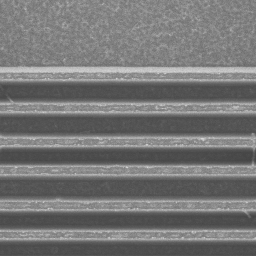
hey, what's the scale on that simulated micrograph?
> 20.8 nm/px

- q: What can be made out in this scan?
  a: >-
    parallel lines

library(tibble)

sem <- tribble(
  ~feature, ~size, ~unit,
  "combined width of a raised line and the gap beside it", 0.661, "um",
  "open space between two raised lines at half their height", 374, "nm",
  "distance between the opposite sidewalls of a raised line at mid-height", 291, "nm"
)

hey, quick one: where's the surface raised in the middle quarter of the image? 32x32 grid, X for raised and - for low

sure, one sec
--------------------------------
XXXXXXXXXXXXXXXXXXXXXXXXXXXXXXXX
XXXXXXXXXXXXXXXXXXXXXXXXXXXXXXXX
XXXXXXXXXXXXXXXXXXXXXXXXXXXXXXXX
XXXXXXXXXXXXXXXXXXXXXXXXXXXXXXXX
--------------------------------
--------------------------------
--------------------------------
--------------------------------
XXXXXXXXXXXXXXXXXXXXXXXXXXXXXXXX
XXXXXXXXXXXXXXXXXXXXXXXXXXXXXXXX
XXXXXXXXXXXXXXXXXXXXXXXXXXXXXXXX
XXXXXXXXXXXXXXXXXXXXXXXXXXXXXXXX
--------------------------------
--------------------------------
--------------------------------
--------------------------------
--------------------------------
XXXXXXXXXXXXXXXXXXXXXXXXXXXXXXXX
XXXXXXXXXXXXXXXXXXXXXXXXXXXXXXXX
XXXXXXXXXXXXXXXXXXXXXXXXXXXXXXXX
--------------------------------
--------------------------------
--------------------------------
--------------------------------
XXXXXXXXXXXXXXXXXXXXXXXXXXXXXXXX
XXXXXXXXXXXXXXXXXXXXXXXXXXXXXXXX
XXXXXXXXXXXXXXXXXXXXXXXXXXXXXXXX
--------------------------------
--------------------------------
--------------------------------
--------------------------------